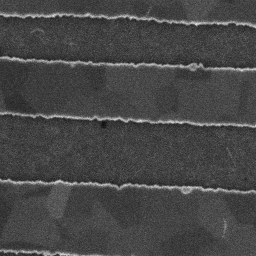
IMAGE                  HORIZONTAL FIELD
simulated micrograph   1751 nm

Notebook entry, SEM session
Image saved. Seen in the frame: one or a few lines or trenches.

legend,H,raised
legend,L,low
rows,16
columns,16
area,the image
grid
HHHHHHHHHHHHHHHH
LLLLLLLLLLLLLLLH
LLLLLLLLLLLLLLLL
LLLLLLLLLLLLLLLL
HHHHHHHHHHHHHHHH
HHHHHHHHHHHHHHHH
HHHHHHHHHHHHHHHH
LLLLLLLHHHHHHHHH
LLLLLLLLLLLLLLLL
LLLLLLLLLLLLLLLL
LLLLLLLLLLLLLLLL
HHHHHHLLLLLLLLLL
HHHHHHHHHHHHHHHH
HHHHHHHHHHHHHHHH
HHHHHHHHHHHHHHHH
HHHHHHHHHHHHHHHH